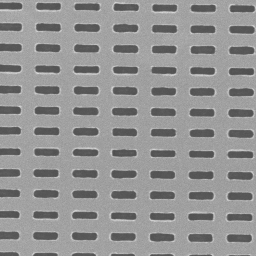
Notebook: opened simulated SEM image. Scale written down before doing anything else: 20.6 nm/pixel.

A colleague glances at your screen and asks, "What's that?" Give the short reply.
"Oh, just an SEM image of a regular array of holes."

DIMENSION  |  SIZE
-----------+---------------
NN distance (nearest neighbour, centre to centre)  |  424 nanometers